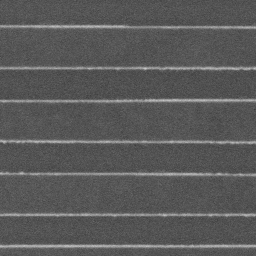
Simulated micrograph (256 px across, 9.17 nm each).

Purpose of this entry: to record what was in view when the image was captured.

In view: lines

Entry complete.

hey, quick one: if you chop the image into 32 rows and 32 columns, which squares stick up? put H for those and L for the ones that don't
LLLLLLLLLLLLLLLLLLLLLLLLLLLLLLLL
LLLLLLLLLLLLLLLLLLLLLLLLLLLLLLLL
LLLLLLLLLLLLLLLLLLLLLLLLLLLLLLLL
HHHHHHHHHHHHHHHHHHHHHHHHHHHHHHHH
HHHHHHHHHHHHHHHHHHHHHHHHHHHHHHHH
HHHHHHHHHHHHHHHHHHHHHHHHHHHHHHHH
HHHHHHHHHHHHHHHHHHHHHHHHHHHHHHHH
HHHHHHHHHHHHHHHHHHHHHHHHHHHHHHHH
HHHHHHHHHHHHHHHHHHHHHHHHHHHHHHHH
LLLLLLLLLLLLLLLLLLLLLLLLLLLLLLLL
LLLLLLLLLLLLLLLLLLLLLLLLLLLLLLLL
LLLLLLLLLLLLLLLLLLLLLLLLLLLLLLLL
LLLLLLLLLLLLLLLLLLLLLLLLLLLLLLLL
HHHHHHHHHHHHHHHHHHHHHHHHHHHHHHHH
HHHHHHHHHHHHHHHHHHHHHHHHHHHHHHHH
HHHHHHHHHHHHHHHHHHHHHHHHHHHHHHHH
HHHHHHHHHHHHHHHHHHHHHHHHHHHHHHHH
HHHHHHHHHHHHHHHHHHHHHHHHHHHHHHHH
LLLLLLLLLLLLLLLLLLLLLLLLLLLLLLLL
LLLLLLLLLLLLLLLLLLLLLLLLLLLLLLLL
LLLLLLLLLLLLLLLLLLLLLLLLLLLLLLLL
LLLLLLLLLLLLLLLLLLLLLLLLLLLLLLLL
HHHHHHHHHHHHHHHHHHHHHHHHHHHHHHHH
HHHHHHHHHHHHHHHHHHHHHHHHHHHHHHHH
HHHHHHHHHHHHHHHHHHHHHHHHHHHHHHHH
HHHHHHHHHHHHHHHHHHHHHHHHHHHHHHHH
HHHHHHHHHHHHHHHHHHHHHHHHHHHHHHHH
LLLLLLLLLLLLLLLLLLLLLLLLLLLLLLLL
LLLLLLLLLLLLLLLLLLLLLLLLLLLLLLLL
LLLLLLLLLLLLLLLLLLLLLLLLLLLLLLLL
LLLLLLLLLLLLLLLLLLLLLLLLLLLLLLLL
HHHHHHHHHHHHHHHHHHHHHHHHHHHHHHHH